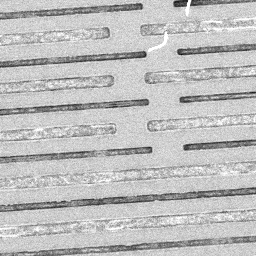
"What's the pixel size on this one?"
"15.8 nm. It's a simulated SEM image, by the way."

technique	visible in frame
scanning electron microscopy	parallel lines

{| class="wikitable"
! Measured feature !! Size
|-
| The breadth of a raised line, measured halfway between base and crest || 224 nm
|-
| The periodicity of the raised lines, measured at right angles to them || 382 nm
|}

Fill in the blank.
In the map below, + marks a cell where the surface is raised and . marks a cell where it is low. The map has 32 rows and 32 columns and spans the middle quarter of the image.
++++++++++++++++++++++++++++++++
++++++++++++++++++++++++++++....
++++++++++++++++++++............
.............+++++++............
.............+++++++.......+..++
............++++++++++++++++++++
.+++++++++++++++++++++++++++++++
++++++++++++++++++++++++++++++++
+++++++++++++++++++++++++++++...
+++++++..............++++++++...
.....................+++++++++++
........++++++++++++++++++++++++
++++++++++++++++++++++++++++++++
++++++++++++++++++++++++++++....
+++++++++++++++++++++...........
+............+++++++............
.............++++++++.........++
............++++++++++++++++++++
++++++++++++++++++++++++++++++++
++++++++++++++++++++++++++++++++
++++++++++++++++++++++++++++++..
++++++................++++++++..
......................++++++++++
......++++++++++++++++++++++++++
++++++++++++++++++++++++++++++++
+++++++++++++++++++++++++++.....
++++++++++++++..................
+...............................
...........................++...
................++++++++++++++++
.+++++++++++++++++++++++++++++++
++++++++++++++++++++++++++++++++